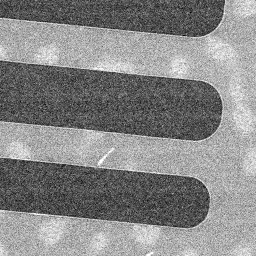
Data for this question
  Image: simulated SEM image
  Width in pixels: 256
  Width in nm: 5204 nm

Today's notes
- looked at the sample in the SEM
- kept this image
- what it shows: one or a few lines or trenches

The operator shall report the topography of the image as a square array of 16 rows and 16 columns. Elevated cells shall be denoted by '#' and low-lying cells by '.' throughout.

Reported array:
##############..
...###########..
................
................
#######.........
#############...
##############..
##############..
.........####...
................
#######.........
#############...
#############...
....#########...
................
................